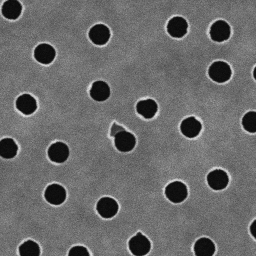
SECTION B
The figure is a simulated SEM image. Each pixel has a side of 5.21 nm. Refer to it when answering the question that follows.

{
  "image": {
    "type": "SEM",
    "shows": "a regular array of holes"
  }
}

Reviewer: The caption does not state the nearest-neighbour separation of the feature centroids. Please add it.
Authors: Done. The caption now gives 0.225 um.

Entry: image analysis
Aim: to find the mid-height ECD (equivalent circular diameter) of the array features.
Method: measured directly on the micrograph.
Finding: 109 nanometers